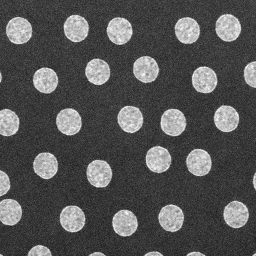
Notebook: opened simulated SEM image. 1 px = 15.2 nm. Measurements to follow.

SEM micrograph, a regular array of raised bodies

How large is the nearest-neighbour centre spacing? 704 nanometres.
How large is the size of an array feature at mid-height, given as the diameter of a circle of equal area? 0.384 microns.